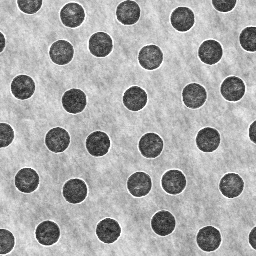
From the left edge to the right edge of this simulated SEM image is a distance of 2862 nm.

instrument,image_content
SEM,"a regular array of holes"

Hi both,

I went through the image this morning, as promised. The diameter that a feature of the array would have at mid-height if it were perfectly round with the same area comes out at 283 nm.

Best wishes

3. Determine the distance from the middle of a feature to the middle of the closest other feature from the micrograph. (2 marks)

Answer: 478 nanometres